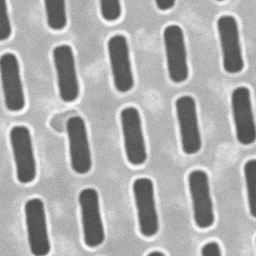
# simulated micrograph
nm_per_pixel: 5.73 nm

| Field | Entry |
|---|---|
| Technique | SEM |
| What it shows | a regular array of holes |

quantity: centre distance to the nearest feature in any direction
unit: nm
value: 317